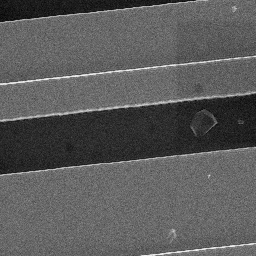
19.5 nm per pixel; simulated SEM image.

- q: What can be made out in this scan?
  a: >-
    lines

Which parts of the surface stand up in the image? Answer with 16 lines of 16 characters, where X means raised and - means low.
--------XXXXXXXX
XXXXXXXXXXXXXXXX
XXXXXXXXXXXXXXXX
XXXXXXXXXXXXXXXX
XXXXXXXXXXXXXXXX
XXXXXXXXXXXXXXXX
XXXXXXXXXX------
X---------------
----------------
-------------XXX
----XXXXXXXXXXXX
XXXXXXXXXXXXXXXX
XXXXXXXXXXXXXXXX
XXXXXXXXXXXXXXXX
XXXXXXXXXXXXXXXX
XXXXXXXXXXXXXXXX